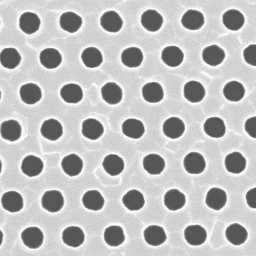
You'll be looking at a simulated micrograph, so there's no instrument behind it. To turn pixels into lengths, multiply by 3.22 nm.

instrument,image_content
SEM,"a regular array of holes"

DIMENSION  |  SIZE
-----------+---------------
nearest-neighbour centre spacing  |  131 nanometres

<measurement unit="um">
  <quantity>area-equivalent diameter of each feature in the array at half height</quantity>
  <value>0.0664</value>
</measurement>